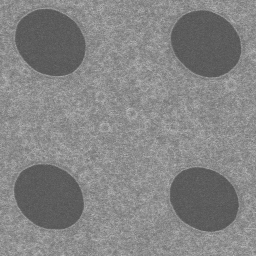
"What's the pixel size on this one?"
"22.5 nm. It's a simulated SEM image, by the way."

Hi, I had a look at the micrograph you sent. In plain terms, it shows holes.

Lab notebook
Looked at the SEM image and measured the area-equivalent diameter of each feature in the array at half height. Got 1520 nm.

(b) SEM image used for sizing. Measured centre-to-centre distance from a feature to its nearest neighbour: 3480 nm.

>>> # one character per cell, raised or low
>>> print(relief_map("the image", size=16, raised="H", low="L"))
HHHHHHHHHHHHHHHH
HLLLLHHHHHHLLLHH
HLLLLHHHHHHLLLLH
HLLLLHHHHHHLLLLH
HHLLLHHHHHHHLLHH
HHHHHHHHHHHHHHHH
HHHHHHHHHHHHHHHH
HHHHHHHHHHHHHHHH
HHHHHHHHHHHHHHHH
HHHHHHHHHHHHHHHH
HHLLHHHHHHHHLHHH
HLLLLHHHHHHLLLHH
HLLLLHHHHHHLLLLH
HHLLLHHHHHHLLLLH
HHHHHHHHHHHHHHHH
HHHHHHHHHHHHHHHH